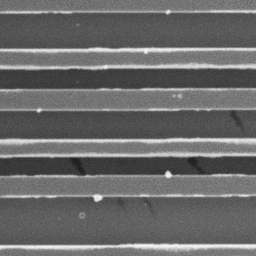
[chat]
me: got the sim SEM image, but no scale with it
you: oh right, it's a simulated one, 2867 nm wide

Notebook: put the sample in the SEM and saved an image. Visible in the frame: lines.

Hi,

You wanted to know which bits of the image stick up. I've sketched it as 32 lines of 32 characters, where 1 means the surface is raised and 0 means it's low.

11111111111111111111111111111111
11111111100000000000110000000000
00000000000000000000000000000000
00000000000000000000000000000000
00000000000000000000000000000000
00000000000000000000000000000000
11111111111111111111111111111111
11111111111111111111111111111111
11100100100000000000000000000000
00000000000000000000000000000000
00000000000000000000000000000000
11111111111111111111111111111111
11111111111111111111111111111111
11111111111111111111111111111111
00000000000000000000000000000000
00000000000000000000000000000000
00000000000000000000000000000000
00000111111111111111111111111111
11111111111111111111111111111111
11111111111111111110000000000000
00000000000000000000000000000000
00000000000000000000000000000000
11111111111111111111111111111111
11111111111111111111111111111111
11111110000110000000000000000000
00000000000000000000000000000000
00000000000000000000000000000000
00000000000000000000000000000000
00000000000000000000000000000000
00000000000000000000000000000000
00000000000000000000000000000000
11111111111111111111111111111111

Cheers